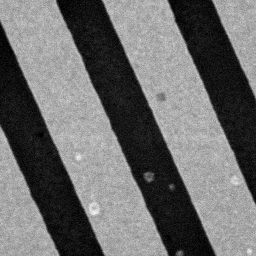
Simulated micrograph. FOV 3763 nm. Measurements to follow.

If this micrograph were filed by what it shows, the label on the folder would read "lines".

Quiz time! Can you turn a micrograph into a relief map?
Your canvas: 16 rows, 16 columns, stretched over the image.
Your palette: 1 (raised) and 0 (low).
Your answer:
1111000111100111
1111000111100011
0111100011100011
0111100011110001
0111100011110001
0011110001111000
0011110001111000
0001111000111100
0001111000111100
1000111100011110
1000111100011110
1100011110001110
1100011110001111
1110011110001111
1110001111000111
1110001111000111